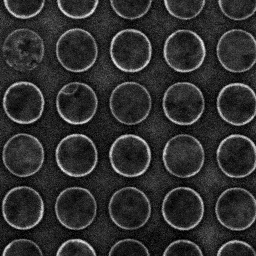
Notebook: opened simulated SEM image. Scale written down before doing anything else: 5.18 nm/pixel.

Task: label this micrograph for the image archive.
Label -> a regular array of raised bodies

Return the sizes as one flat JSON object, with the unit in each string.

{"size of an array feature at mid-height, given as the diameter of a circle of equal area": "216 nm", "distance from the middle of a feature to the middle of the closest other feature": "0.271 micrometres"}